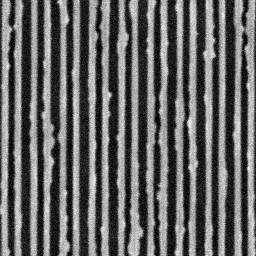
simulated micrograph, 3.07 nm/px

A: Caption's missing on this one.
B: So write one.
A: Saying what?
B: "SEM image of parallel lines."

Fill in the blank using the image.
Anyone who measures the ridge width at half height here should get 21.1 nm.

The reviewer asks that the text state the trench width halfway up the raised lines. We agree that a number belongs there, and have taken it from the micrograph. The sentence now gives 23.8 nm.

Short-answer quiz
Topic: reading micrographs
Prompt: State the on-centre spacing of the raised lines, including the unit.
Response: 0.0444 microns